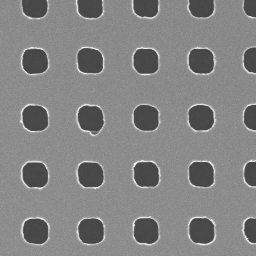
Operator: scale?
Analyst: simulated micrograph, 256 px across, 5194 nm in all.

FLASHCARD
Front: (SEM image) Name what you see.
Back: a regular array of holes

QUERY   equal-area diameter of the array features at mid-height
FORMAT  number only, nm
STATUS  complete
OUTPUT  541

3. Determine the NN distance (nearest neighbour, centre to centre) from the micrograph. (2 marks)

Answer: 1120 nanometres